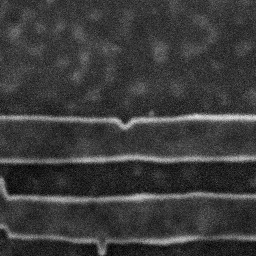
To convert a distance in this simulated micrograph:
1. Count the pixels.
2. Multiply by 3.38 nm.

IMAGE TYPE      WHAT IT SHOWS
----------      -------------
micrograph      one or a few lines or trenches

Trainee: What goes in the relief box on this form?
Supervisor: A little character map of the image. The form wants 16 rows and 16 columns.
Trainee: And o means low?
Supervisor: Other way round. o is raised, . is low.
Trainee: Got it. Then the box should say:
................
................
................
................
................
................
................
ooooooo..ooooooo
oooooooooooooooo
oooooooooooooooo
................
................
oooooooooooooooo
oooooooooooooooo
oooooooooooooooo
................